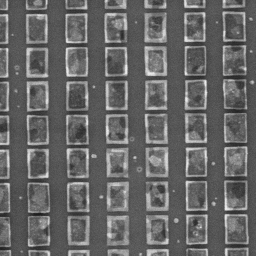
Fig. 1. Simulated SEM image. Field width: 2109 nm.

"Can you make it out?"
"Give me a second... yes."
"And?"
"wiring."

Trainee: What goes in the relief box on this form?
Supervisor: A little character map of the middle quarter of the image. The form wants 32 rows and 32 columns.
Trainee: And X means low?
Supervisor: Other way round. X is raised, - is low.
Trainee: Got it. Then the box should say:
-XXXXX-----XXXXX-----XXXX------X
-XXXXX-----XXXXX-----XXXX------X
-XXXXX-----XXXX----------------X
--------------------------------
-------------------------------X
-XXXX------XXXXX-----XXXX------X
-XXXXX-----XXXXX-----XXXX------X
-XXXXX-----XXXXX-----XXXX------X
-XXXXX-----XXXXX-----XXXX------X
-XXXXX-----XXXXX-----XXXX------X
-XXXXX-----XXXXX-----XXXX------X
--------------------------------
--------------------------------
-XXXXX-----XXXXX-----XXXX------X
-XXXXX-----XXXXX-----XXXX------X
-XXXXX-----XXXXX-----XXXX------X
-XXXXX-----XXXXX-----XXXX------X
-XXXXX-----XXXXX-----XXXX------X
-XXXXX-----XXXXX-----XXXX------X
-XXXXX--------------------------
--------------------------------
-XXXXX--------X------XXXX------X
-XXXXX-----XXXXX-----XXXX------X
-XXXXX-----XXXX------XXXX------X
-XXXXX-----XXXX------XXXX------X
-XXXXX-----XXXX------XXXX------X
-XXXXX-----XXXX------XXXX------X
-XXXXX-----XXXX------XXXX------X
--------------------------------
-------------------------------X
-XXXXX-----XXXXX-----XXXX------X
-XXXXX-----XXXXX-----XXXXX-----X